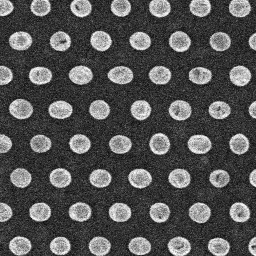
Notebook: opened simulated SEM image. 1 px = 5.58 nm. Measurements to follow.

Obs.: a regular array of raised bodies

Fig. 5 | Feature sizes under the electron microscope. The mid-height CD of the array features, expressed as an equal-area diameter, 109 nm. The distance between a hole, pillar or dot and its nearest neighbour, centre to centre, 219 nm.